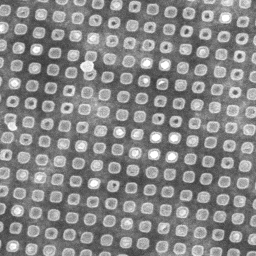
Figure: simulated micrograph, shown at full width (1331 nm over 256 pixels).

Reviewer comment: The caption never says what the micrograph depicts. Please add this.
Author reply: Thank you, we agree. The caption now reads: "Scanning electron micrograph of a regular array of raised bodies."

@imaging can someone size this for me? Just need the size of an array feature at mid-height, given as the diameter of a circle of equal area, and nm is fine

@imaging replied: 60.2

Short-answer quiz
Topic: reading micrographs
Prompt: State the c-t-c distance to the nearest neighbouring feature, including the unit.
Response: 0.091 micrometres